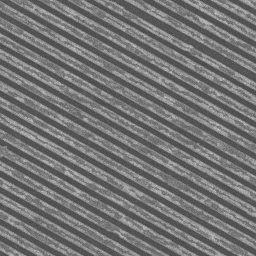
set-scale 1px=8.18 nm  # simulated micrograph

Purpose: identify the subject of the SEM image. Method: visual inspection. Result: parallel lines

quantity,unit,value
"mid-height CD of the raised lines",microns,0.0633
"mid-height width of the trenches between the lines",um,0.0482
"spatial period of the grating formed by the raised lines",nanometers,114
